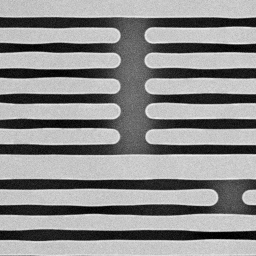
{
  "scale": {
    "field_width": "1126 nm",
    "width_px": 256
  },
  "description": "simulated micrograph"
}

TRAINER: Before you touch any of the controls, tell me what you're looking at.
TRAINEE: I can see groups of lines, slits or small figures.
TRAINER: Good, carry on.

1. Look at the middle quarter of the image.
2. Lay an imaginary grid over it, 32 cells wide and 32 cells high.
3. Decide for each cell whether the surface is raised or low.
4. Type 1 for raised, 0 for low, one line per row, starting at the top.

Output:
11111111111110000000011111111111
00000000000000000000000000000000
00000000000000000000000000000000
00000000000000000000000000000000
11111111111111000000011111111111
11111111111111000000111111111111
11111111111111000000011111111111
00000000000000000000000000000000
00000000000000000000000000000000
00000000000000000000000000000000
11111111111110000000011111111111
11111111111111000000011111111111
11111111111111000000011111111111
11111111111110000000001111111111
00000000000000000000000000000000
00000000000000000000000000000000
11111111111100000000000001111111
11111111111111000000011111111111
11111111111111000000011111111111
11111111111110000000011111111111
00000000000000000000000000000000
00000000000000000000000000000000
00000000000000000000000000000000
11111111111111111111111111111111
11111111111111111111111111111111
11111111111111111111111111111111
11111111111111111111111111111111
11111111111111111111111111111111
11111111111111111111111100111111
00000000000000000000000000000000
00000000000000000000000000000000
11111111111111000000000000000000